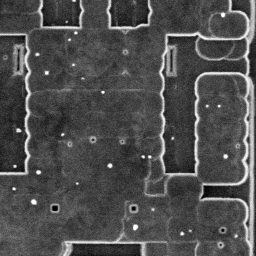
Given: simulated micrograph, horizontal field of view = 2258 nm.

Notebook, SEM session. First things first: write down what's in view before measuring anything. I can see wiring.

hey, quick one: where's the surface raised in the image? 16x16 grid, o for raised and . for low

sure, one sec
ooo..oo..oooooo.
ooo..oo..oooooo.
..ooooooooo.....
..oooooooo......
..oooooooo......
..oooooooo..ooo.
..oooooooo..ooo.
..oooooooo..ooo.
..oooooooo..ooo.
..oooooooo..ooo.
..oooooooo..ooo.
ooooooooooooooo.
ooooooooooooooo.
ooooooooooooooo.
ooooooooooooooo.
oooo.....ooooooo